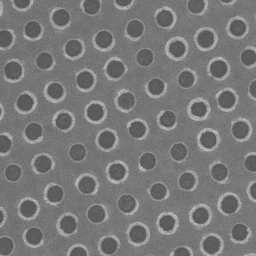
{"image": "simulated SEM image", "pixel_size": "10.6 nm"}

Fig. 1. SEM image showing a regular array of holes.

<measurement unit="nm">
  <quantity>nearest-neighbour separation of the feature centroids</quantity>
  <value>326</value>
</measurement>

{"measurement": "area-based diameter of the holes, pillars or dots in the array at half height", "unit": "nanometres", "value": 184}